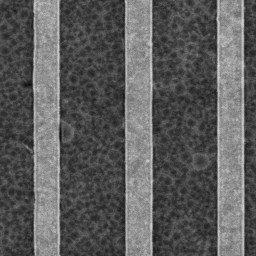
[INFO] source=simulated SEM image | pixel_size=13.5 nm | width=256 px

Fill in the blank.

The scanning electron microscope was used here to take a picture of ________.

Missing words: one or a few lines or trenches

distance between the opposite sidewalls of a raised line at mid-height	0.335	micrometres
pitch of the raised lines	1250	nm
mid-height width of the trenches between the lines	916	nm